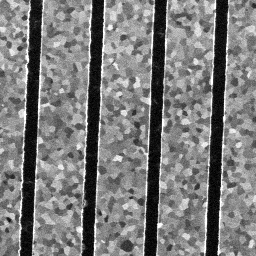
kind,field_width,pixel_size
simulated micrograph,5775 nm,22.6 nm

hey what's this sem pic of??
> one or a few lines or trenches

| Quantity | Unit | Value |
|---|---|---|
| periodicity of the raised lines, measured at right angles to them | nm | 1400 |